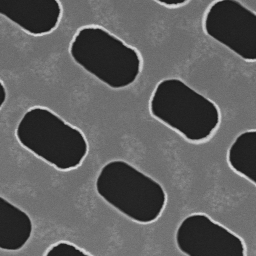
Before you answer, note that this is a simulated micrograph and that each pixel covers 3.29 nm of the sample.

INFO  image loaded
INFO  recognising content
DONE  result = holes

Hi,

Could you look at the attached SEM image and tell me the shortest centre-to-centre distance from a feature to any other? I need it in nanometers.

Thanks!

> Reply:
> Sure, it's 311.